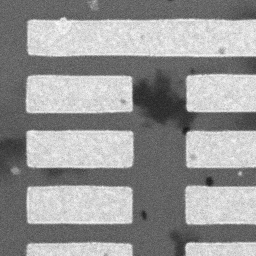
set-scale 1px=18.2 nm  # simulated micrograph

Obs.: wiring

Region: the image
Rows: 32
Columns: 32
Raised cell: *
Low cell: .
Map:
................................
................................
.......**.......................
....****************************
....****************************
....****************************
....****************************
................................
................................
.........................****...
...*************.......*********
...*************........********
...*************........********
...*************.......*********
................................
................................
....************........**.*****
...**************......*********
...**************......*********
...**************......*********
....************........********
................................
................................
....************........********
....************.......*********
....************.......*********
....************.......*********
....************.......*********
................................
................................
..........***...........*....***
...*************.......*********